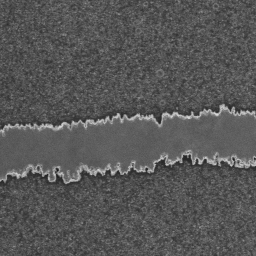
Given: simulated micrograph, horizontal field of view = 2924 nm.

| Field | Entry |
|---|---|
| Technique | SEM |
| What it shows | one or a few lines or trenches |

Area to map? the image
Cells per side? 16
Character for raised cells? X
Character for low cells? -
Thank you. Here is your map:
----------------
----------------
----------------
----------------
----------------
----------------
----------------
-------XXXXXXXXX
XXXXXXXXXXXXXXXX
XXXXXXXXXXXXXXXX
XXXXXXXXXX------
----------------
----------------
----------------
----------------
----------------